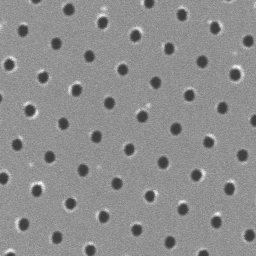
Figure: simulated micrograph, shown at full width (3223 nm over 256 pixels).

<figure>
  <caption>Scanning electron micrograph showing a regular array of holes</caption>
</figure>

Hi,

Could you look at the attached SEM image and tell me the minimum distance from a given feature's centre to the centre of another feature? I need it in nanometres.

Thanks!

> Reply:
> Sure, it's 447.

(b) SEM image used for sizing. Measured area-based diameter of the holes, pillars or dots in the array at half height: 153 nanometers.